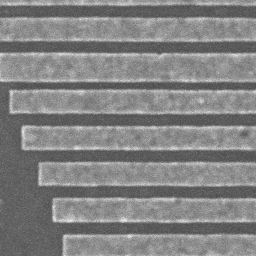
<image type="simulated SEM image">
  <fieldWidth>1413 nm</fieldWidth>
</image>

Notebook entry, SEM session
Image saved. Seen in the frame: parallel lines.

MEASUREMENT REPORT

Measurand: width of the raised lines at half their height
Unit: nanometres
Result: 128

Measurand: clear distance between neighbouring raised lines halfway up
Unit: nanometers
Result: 74.6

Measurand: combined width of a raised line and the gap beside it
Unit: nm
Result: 201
